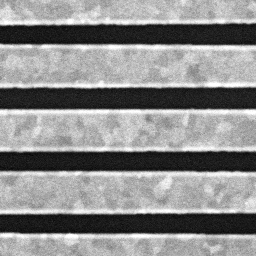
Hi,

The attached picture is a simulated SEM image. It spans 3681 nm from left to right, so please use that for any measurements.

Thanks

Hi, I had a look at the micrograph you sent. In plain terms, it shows lines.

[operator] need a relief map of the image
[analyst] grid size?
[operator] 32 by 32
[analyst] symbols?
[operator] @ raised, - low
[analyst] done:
@@@@@@@@@@@@@@@@@@@@@@@@@@@@@@@@
@@@@@@@@@@@@@@@@@@@@@@@@@@@@@@@@
@@@@@@@@@@@@@@@@@@@@@@@@@@@@@@@@
--------------------------------
--------------------------------
--------------------------------
@@@@@@@@@@@@@@@@@@@@@@@@@@@@@@@@
@@@@@@@@@@@@@@@@@@@@@@@@@@@@@@@@
@@@@@@@@@@@@@@@@@@@@@@@@@@@@@@@@
@@@@@@@@@@@@@@@@@@@@@@@@@@@@@@@@
@@@@@@@@@@@@@@@@@@@@@@@@@@@@@@@@
--------------------------------
--------------------------------
--------------------------------
@@@@@@@@@@@@@@@@@@@@@@@@@@@@@@@@
@@@@@@@@@@@@@@@@@@@@@@@@@@@@@@@@
@@@@@@@@@@@@@@@@@@@@@@@@@@@@@@@@
@@@@@@@@@@@@@@@@@@@@@@@@@@@@@@@@
@@@@@@@@@@@@@@@@@@@@@@@@@@@@@@@@
--------------------------------
--------------------------------
@-@@@-------@-------------------
@@@@@@@@@@@@@@@@@@@@@@@@@@@@@@@@
@@@@@@@@@@@@@@@@@@@@@@@@@@@@@@@@
@@@@@@@@@@@@@@@@@@@@@@@@@@@@@@@@
@@@@@@@@@@@@@@@@@@@@@@@@@@@@@@@@
@@@@@@@@@@@@@@@@@@@@@@@@@@@@@@@@
--------------------------------
--------------------------------
@@@@@@@@@@@@@@@@@@@@@@@@@@@@@@@@
@@@@@@@@@@@@@@@@@@@@@@@@@@@@@@@@
@@@@@@@@@@@@@@@@@@@@@@@@@@@@@@@@